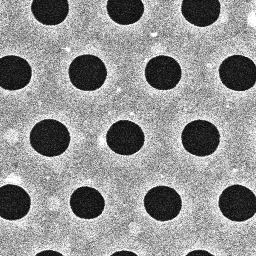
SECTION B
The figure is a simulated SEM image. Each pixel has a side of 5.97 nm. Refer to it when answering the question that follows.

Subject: holes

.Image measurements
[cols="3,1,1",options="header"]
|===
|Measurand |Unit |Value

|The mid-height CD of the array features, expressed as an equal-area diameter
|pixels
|37.6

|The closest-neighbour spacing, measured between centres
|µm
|0.447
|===